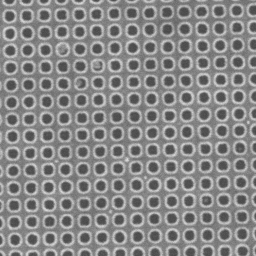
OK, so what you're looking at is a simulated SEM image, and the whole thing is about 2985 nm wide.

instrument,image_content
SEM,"a regular array of holes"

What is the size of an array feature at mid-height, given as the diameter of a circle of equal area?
139 nm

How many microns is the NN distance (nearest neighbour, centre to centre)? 0.199